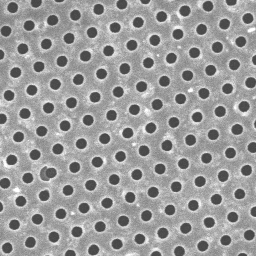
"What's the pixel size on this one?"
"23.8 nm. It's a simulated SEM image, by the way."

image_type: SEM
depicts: a regular array of holes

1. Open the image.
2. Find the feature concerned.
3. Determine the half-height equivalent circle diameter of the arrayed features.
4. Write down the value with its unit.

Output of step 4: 11.3 px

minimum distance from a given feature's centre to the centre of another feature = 560 nanometers